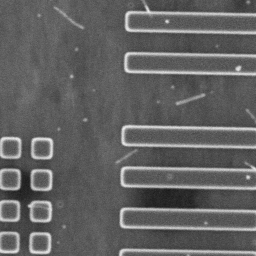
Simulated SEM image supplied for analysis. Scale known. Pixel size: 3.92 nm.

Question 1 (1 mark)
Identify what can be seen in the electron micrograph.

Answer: groups of lines, slits or small figures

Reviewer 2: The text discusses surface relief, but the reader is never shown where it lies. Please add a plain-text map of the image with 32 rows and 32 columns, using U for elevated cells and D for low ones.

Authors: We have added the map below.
DDDDDDDDDDDDDDDDDDDDDDDDDDDDDDDD
DDDDDDDDDDDDDDDDDDUDDDDDDDDDDDDD
DDDDDDDDDDDDDDDDUUUUUUUUUUUUUUUU
DDDDDDDDDDDDDDDDUUUUUUUUUUUUUUUU
DDDDDDDDDDDDDDDDDDDDDDDDDDDDDDDD
DDDDDDDDDDDDDDDDDDDDDDDDDDDDDDDD
DDDDDDDDDDDDDDDDDDDDDDDDDDDDDDDD
DDDDDDDDDDDDDDDDUUUUUUUUUUUUUUUU
DDDDDDDDDDDDDDDDUUUUUUUUUUUUUUUU
DDDDDDDDDDDDDDDDDDDDDDDDDDDDDDDD
DDDDDDDDDDDDDDDDDDDDDDDDDDDDDDDD
DDDDDDDDDDDDDDDDDDDDDDDDDDDDDDDD
DDDDDDDDDDDDDDDDDDDDDDDDDDDDDDDD
DDDDDDDDDDDDDDDDDDDDDDDDDDDDDDDD
DDDDDDDDDDDDDDDDDDDDDDDDDDDDDDDD
DDDDDDDDDDDDDDDDDDDDDDDDDDDDDDDD
DDDDDDDDDDDDDDDUUUUUUUUUUUUUUUUU
UUDDUUDDDDDDDDDUUUUUUUUUUUUUUUUU
UUDDUUDDDDDDDDDDDDDDDDDDDDDDDDDD
UUDDUUDDDDDDDDDDDDDDDDDDDDDDDDDD
DDDDDDDDDDDDDDDDDDDDDDDDDDDDDDDD
UUDDUUDDDDDDDDDUUUUUUUUUUUUUUUUU
UUDDUUDDDDDDDDDUUUUUUUUUUUUUUUUU
UUDDUUDDDDDDDDDDDDDDDDDDDDDUUUUU
DDDDDDDDDDDDDDDDDDDDDDDDDDDDDDDD
UUDDUUDDDDDDDDDDDDDDDDDDDDDDDDDD
UUDDUUDDDDDDDDDUUUUUUUUUUUUUUUUU
UUDDUUDDDDDDDDDUUUUUUUUUUUUUUUUU
DDDDDDDDDDDDDDDDDDDDDDDUUUUUUUUU
UUDDUUDDDDDDDDDDDDDDDDDDDDDDDDDD
UUDDUUDDDDDDDDDDDDDDDDDDDDDDDDDD
DDDDUUDDDDDDDDDUUUUUUUUUUUUUUUDD